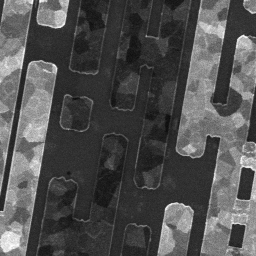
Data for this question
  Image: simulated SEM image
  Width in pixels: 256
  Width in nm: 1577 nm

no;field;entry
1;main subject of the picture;parallel lines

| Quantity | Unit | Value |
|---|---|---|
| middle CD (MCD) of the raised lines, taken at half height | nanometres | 173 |